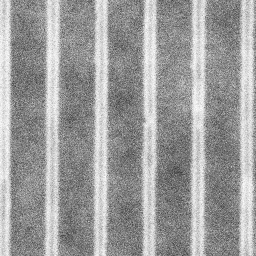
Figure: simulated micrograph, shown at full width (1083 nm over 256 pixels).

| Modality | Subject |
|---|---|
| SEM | parallel lines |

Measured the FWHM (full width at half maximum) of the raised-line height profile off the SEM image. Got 37.5 nm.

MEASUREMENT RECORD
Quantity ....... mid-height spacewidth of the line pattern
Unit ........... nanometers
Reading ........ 168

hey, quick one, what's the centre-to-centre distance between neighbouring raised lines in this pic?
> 48.6 pixels